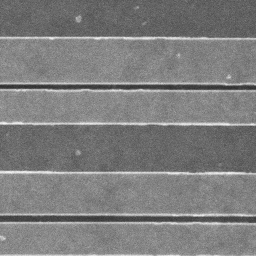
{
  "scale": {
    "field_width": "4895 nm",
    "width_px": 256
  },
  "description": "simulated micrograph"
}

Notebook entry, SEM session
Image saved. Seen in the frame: lines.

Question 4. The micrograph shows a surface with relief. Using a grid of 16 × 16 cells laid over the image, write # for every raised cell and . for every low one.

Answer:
................
................
################
################
################
################
################
################
................
................
................
################
################
################
################
################